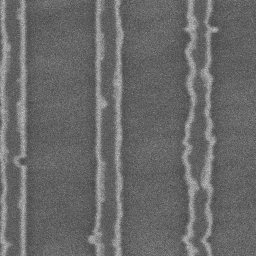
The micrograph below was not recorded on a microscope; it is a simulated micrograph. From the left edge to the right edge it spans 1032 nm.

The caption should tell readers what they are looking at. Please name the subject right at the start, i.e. one or a few lines or trenches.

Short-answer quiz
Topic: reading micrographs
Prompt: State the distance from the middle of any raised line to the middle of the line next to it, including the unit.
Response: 0.375 microns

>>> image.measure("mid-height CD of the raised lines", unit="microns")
0.0816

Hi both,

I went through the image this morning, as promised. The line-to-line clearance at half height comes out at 298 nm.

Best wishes